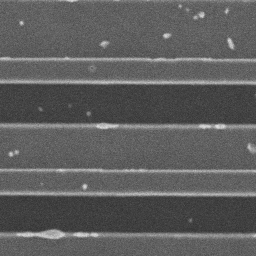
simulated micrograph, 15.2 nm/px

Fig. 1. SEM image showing lines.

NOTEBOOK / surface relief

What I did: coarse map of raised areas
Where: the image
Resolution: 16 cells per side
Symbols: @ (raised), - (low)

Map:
@@@@@@@@@@@@@@@@
@@@@@@@@@@@@@@@@
@@@@@@@@@@@@@@@@
@@@@@@@@@@@@@@@@
@@@@@@@@@@@@@@@@
----------------
----------------
----------------
@@@@@@@@@@@@@@@@
@@@@@@@@@@@@@@@@
@@@@@@@@@@@@@@@@
@@@@@@@@@@@@@@@@
----------------
----------------
--@@------------
@@@@@@@@@@@@@@@@